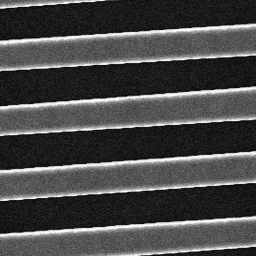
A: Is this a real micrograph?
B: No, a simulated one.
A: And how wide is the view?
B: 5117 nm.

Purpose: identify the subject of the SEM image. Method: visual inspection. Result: lines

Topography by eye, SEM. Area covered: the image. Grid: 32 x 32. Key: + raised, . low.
+++++++.........................
................................
................................
........................++++++++
..........++++++++++++++++++++++
++++++++++++++++++++++++++++++++
++++++++++++++++++++++++++++++++
++++++++++++++++++++++..........
++++++..........................
................................
................................
.......................+++++++++
...........+++++++++++++++++++++
++++++++++++++++++++++++++++++++
++++++++++++++++++++++++++++++++
+++++++++++++++++++++++.........
++++++..........................
................................
................................
.........................+++++++
...........+++++++++++++++++++++
++++++++++++++++++++++++++++++++
++++++++++++++++++++++++++++++++
+++++++++++++++++++++++.........
++++++++........................
................................
................................
...........................+++++
...........+++++++++++++++++++++
++++++++++++++++++++++++++++++++
++++++++++++++++++++++++++++++++
++++++++++++++++++++++..........